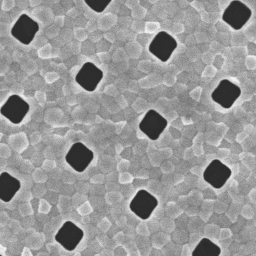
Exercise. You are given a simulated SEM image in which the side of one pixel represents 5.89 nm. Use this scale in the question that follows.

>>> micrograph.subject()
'a regular array of holes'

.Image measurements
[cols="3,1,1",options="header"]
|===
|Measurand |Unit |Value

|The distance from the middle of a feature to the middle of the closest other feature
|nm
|468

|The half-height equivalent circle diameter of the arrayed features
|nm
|155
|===